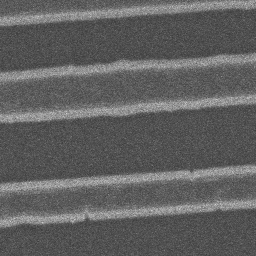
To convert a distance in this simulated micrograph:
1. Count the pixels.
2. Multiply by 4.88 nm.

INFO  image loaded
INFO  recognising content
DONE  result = one or a few lines or trenches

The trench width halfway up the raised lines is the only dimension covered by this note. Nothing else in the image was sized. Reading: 289 nm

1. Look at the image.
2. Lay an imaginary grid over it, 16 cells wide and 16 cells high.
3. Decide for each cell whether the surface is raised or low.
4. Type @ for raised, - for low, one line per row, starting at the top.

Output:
@@@@@@@@@@@@----
----------------
----------------
----------------
--@@@@@@@@@@@@@@
@@@@@@@@@@@@@@@@
@@@@@@@@@@@@@---
----------------
----------------
----------------
---------------@
--@@@@@@@@@@@@@@
@@@@@@@@@@@@@@@@
@@@@@@@---------
----------------
----------------